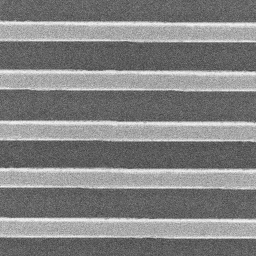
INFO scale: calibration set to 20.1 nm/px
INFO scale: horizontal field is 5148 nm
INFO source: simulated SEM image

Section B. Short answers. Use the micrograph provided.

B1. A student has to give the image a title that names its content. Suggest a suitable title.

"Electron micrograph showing lines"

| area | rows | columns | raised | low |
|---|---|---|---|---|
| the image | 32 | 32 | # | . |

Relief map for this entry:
................................
................................
................................
################################
################################
................................
................................
................................
................................
################################
################################
................................
................................
................................
................................
################################
################################
.............###################
................................
................................
................................
################################
################################
............................####
................................
................................
................................
##############################..
################################
################################
................................
................................